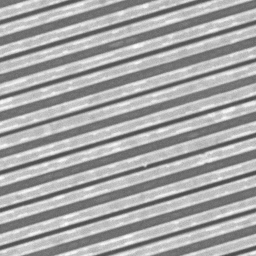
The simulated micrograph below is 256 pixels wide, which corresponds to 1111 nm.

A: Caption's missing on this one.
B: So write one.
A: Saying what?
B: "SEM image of parallel lines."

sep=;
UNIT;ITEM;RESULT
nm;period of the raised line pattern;78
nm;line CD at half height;43.2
